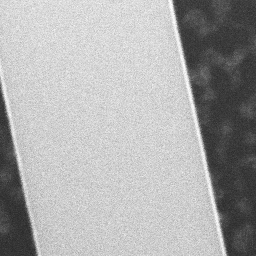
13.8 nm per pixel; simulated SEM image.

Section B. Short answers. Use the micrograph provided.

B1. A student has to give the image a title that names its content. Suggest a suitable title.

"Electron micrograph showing one or a few lines or trenches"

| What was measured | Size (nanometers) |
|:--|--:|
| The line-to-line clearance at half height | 2490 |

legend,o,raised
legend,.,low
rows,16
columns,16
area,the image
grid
...........ooooo
...........ooooo
...........ooooo
...........ooooo
............oooo
............oooo
o...........oooo
o...........oooo
o...........oooo
o............ooo
o............ooo
oo...........ooo
oo...........ooo
oo...........ooo
oo............oo
oo............oo